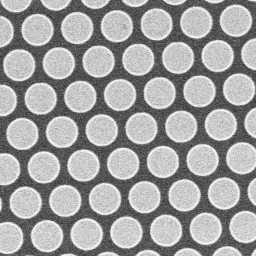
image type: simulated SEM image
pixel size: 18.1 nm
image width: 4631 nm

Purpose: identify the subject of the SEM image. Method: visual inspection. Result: an array of small figures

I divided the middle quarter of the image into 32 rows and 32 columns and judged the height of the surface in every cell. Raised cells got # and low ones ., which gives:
##...#######...#######...#######
##...#######....#####.....#####.
#.....#####......###............
................................
....#.......####.....######....#
.######....######....######...##
.#######..########..########..##
########..########..########..##
########..########..#######...##
.#######...######....######....#
.######....######.....####......
..####..........................
..................##.......####.
#......#####....######....######
##....#######...#######...######
###...#######...#######...######
###...#######...#######...######
###...#######...#######...######
###...#######...######.....#####
##.....#####.....####...........
#...............................
.............###......#####.....
..######....######...#######...#
.#######...#######...#######...#
.########..########..#######...#
.########..#######...#######...#
.#######...#######...#######....
..######....######....#####.....
...####......###................
....................#.......####
#.......####......#####....#####
###....######....######....#####